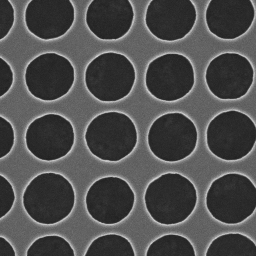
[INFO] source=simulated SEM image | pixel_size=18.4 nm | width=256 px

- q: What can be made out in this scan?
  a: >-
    a regular array of holes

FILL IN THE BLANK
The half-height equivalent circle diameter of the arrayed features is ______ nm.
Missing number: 893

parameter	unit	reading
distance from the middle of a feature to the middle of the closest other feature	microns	1.11